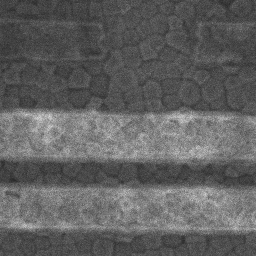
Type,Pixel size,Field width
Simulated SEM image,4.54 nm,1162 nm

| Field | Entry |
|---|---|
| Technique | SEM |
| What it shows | one or a few lines or trenches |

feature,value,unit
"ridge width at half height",172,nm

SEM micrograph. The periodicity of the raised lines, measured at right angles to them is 0.361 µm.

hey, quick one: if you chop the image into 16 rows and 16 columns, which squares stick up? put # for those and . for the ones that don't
................
#####........#..
######......####
#.####......####
................
................
................
################
################
################
................
................
################
################
................
................